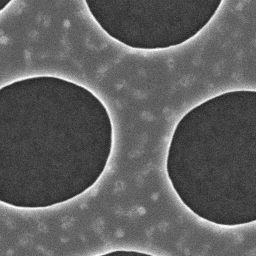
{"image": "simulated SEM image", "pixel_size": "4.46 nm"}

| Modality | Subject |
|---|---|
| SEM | holes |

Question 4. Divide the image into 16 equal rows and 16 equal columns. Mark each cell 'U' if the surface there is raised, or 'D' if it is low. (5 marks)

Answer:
UUUUUUDDDDDDDDUU
UUUUUUDDDDDDDUUU
UUUUUUUDDDDDUUUU
UUUUUUUUUUUUUUUU
UUUUUUUUUUUUUUUU
DDDDDUUUUUUUUUUU
DDDDDDUUUUUUUDDD
DDDDDDDUUUUDDDDD
DDDDDDDUUUUDDDDD
DDDDDDDUUUUDDDDD
DDDDDDDUUUDDDDDD
DDDDDDUUUUUDDDDD
DDDDUUUUUUUDDDDD
UUUUUUUUUUUUDDDD
UUUUUUUUUUUUUUUU
UUUUUUUUUUUUUUUU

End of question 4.